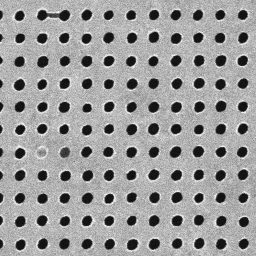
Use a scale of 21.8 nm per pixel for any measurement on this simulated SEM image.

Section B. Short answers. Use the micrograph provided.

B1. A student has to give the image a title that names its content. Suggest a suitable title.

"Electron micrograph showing a regular array of holes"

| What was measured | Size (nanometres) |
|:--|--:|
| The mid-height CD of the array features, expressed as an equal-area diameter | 230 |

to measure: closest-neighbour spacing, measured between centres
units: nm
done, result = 476